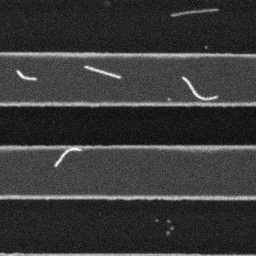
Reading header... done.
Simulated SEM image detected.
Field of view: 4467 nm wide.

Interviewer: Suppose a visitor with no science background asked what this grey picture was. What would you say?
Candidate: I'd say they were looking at lines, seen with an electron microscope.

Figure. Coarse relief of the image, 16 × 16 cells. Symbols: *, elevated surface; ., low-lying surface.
................
................
................
****************
****************
****************
****************
................
................
****************
****************
****************
................
................
................
................